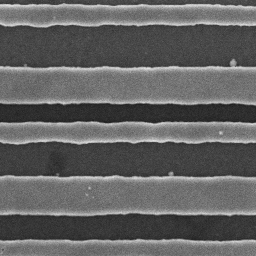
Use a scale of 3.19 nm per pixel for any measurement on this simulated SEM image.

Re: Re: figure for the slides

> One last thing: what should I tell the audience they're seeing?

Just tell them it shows lines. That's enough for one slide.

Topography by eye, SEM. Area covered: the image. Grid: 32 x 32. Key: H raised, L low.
LLLLLLLLLLLLLLLLLLLLLLLLLLLLLLLL
HHHHHHHHHHHHHHHHHHHHHHHHHHHHHHHH
HHHHHHHHHHHHHHHHHHHHHHHHHHHHHHHH
LLLLLLLLLLLLLLLLLLLLLLLLLLLLLLLL
LLLLLLLLLLLLLLLLLLLLLLLLLLLLLLLL
LLLLLLLLLLLLLLLLLLLLLLLLLLLLLLLL
LLLLLLLLLLLLLLLLLLLLLLLLLLLLLLLL
LLLLLLLLLLLLLLLLLLLLLLLLLLLLLLLL
HHLHLLLHHLLLHHHLLLLHHHHHHHHHHHHH
HHHHHHHHHHHHHHHHHHHHHHHHHHHHHHHH
HHHHHHHHHHHHHHHHHHHHHHHHHHHHHHHH
HHHHHHHHHHHHHHHHHHHHHHHHHHHHHHHH
HHHHHHHHHHHHHHHHHHHHHHHHHHHHHHHH
LLLLLLLLLLLLLLLLLLLLLLLLLLLLLLLL
LLLLLLLLLLLLLLLLLLLLLLLLLLLLLLLL
HHHHHHHHHHHHHHHHHHHHHHHHHHHHHHHH
HHHHHHHHHHHHHHHHHHHHHHHHHHHHHHHH
HHHHHHHHHHHHHHHHHHHHHHHHHHHHHHHH
LLLLLLLLLLLLLLLLLLLLLLLLLLLLLLLL
LLLLLLLLLLLLLLLLLLLLLLLLLLLLLLLL
LLLLLLLLLLLLLLLLLLLLLLLLLLLLLLLL
LLLLLLLLLLLLLLLLLLLLLLLLLLLLLLLL
HHHHHHHHHHHHHHHHHHHHHHHHHHHHHHHH
HHHHHHHHHHHHHHHHHHHHHHHHHHHHHHHH
HHHHHHHHHHHHHHHHHHHHHHHHHHHHHHHH
HHHHHHHHHHHHHHHHHHHHHHHHHHHHHHHH
HHHHHHHHHHHHHHHHHHHHHHHHHHHHHHHH
LLLLLLLLLLLLLLLLLLLLLLLLLLLLLLLL
LLLLLLLLLLLLLLLLLLLLLLLLLLLLLLLL
LLLLLLLLLLLLLLLLLLLLLLLLLLLLLLLL
HHHHHHHHHHHHHHHHHHHHHHHHHHHHHHHH
HHHHHHHHHHHHHHHHHHHHHHHHHHHHHHHH